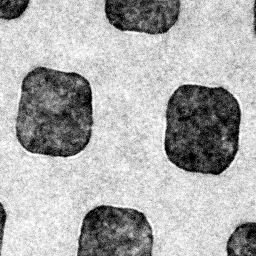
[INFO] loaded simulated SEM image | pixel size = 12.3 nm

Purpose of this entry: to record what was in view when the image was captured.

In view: holes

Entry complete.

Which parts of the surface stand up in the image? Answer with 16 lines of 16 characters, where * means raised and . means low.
..*****....*****
*******....*****
****************
****************
**..************
*.....*****...**
*.....****.....*
*.....****.....*
*.....****.....*
**...*****.....*
***********...**
****************
****************
*****....*******
*****.....*****.
*****.....****..